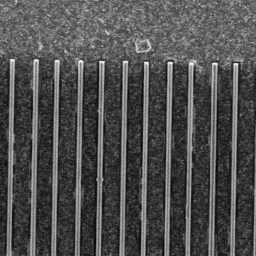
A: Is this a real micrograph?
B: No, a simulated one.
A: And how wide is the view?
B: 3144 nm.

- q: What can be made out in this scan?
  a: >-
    parallel lines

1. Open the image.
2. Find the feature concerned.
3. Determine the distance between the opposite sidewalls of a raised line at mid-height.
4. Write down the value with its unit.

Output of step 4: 44.5 nm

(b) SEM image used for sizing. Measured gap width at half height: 232 nm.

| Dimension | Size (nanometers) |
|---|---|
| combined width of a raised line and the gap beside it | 274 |